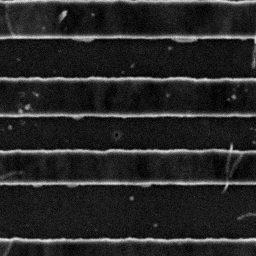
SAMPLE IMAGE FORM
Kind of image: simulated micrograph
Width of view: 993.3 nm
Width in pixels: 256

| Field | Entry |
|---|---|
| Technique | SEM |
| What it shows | lines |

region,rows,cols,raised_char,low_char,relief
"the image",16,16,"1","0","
1111111111111111
1111111111111111
0000000000000000
0000000000000000
0000000000000000
1111111111111111
1111111111111111
0000000000000000
0000000000000000
1111111111111111
1111111111111111
0000000000000010
0000000000000000
0000000000000000
0000000000000000
1111111111111111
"